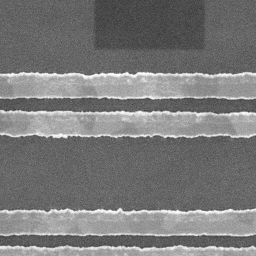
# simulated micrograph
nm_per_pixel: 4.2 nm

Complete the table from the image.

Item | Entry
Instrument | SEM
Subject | lines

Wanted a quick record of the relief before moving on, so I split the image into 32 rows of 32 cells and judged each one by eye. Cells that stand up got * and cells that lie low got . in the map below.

................................
................................
................................
................................
................................
................................
................................
................................
................................
********************************
********************************
********************************
................................
................................
********************************
********************************
********************************
................................
................................
................................
................................
................................
................................
................................
................................
................................
***********************.********
********************************
********************************
................................
................................
********************************